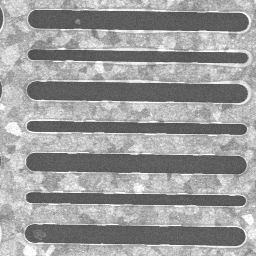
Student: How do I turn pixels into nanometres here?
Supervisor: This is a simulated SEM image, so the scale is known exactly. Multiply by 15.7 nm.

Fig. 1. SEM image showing groups of lines, slits or small figures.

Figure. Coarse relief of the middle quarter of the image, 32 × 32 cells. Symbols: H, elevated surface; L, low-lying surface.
HHHHHHHHHHHHHHHHHHHHHHHHHHHHHHHH
HHHHHHHHHHHHHHHHHHHHHHHHHHHHHHHH
HHHHHHHHHHHHHHHHHHHHHHHHHHHHHHHH
HHHHHHHHHHHHHHHHHHHHHHHHHHHHHHHH
LLLLLLLLLLLLLLLLLLLLLLLLLHHHHHHH
LLLLLLLLLLLLLLLLLLLLLLLLLLLLLLLL
LLLLLLLLLLLLLLLLLLLLLLLLLLLLLLLL
LLLLLLLLLLLLLLLLLLLLLLLLLLLLLLLL
LLLLLLLLLLLLLLLLLLLLLLLLLLLLLLLL
HHHHHHHHHHHHHHHLLLLLLLLLLLLLLLLL
HHHHHHHHHHHHHHHHHHHHHHHHHHHHHHHH
HHHHHHHHHHHHHHHHHHHHHHHHHHHHHHHH
HHHHHHHHHHHHHHHHHHHHHHHHHHHHHHHH
HHHHHHHHHHHHHHHHHHHHHHHHHHHHHHHH
LLLLLLLLLLLLLLLLLLLLLLLLLLLLHHHH
LLLLLLLLLLLLLLLLLLLLLLLLLLLLLLLL
LLLLLLLLLLLLLLLLLLLLLLLLLLLLLLLL
HHHHHHHHHHHHHHHHLLLLLLLLLLLLLLLL
HHHHHHHHHHHHHHHHHHHHHHHHHHHHHHHH
HHHHHHHHHHHHHHHHHHHHHHHHHHHHHHHH
HHHHHHHHHHHHHHHHHHHHHHHHHHHHHHHH
HHHHHHHHHHHHHHHHHHHHHHHHHHHHHHHH
LLLLLLLLLLLLLLLLLLLLLLLLLLLHHHHH
LLLLLLLLLLLLLLLLLLLLLLLLLLLLLLLL
LLLLLLLLLLLLLLLLLLLLLLLLLLLLLLLL
LLLLLLLLLLLLLLLLLLLLLLLLLLLLLLLL
LLLLLLLLLLLLLLLLLLLLLLLLLLLLLLLL
HHHHHHHHHHHHHHHHHHHHHHHHLLLLLLLL
HHHHHHHHHHHHHHHHHHHHHHHHHHHHHHHH
HHHHHHHHHHHHHHHHHHHHHHHHHHHHHHHH
HHHHHHHHHHHHHHHHHHHHHHHHHHHHHHHH
HHHHHHHHHHHHHHHHHHHHHHHHHHHHHHHH